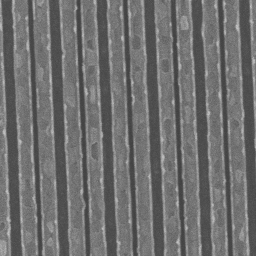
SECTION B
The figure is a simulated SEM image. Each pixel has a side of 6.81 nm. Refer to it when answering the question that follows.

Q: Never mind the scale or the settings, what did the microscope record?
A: parallel lines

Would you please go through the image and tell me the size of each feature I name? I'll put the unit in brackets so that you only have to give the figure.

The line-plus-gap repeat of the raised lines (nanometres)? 160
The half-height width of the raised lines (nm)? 109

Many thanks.